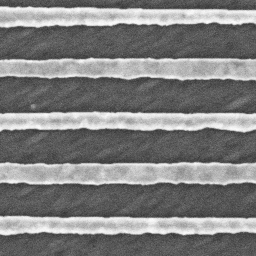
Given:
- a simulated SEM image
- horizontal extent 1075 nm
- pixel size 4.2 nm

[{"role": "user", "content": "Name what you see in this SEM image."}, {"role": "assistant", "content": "lines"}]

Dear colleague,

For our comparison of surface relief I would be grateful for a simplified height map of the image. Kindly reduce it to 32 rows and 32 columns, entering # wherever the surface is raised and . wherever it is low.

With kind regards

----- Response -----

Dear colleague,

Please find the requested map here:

................................
################################
################################
................................
................................
................................
................................
.......##..###################..
################################
#.##############################
................................
................................
................................
................................
################################
################################
................................
................................
................................
................................
###.##..#.###.###############.##
################################
################################
................................
................................
................................
................................
################################
################################
................................
................................
................................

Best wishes